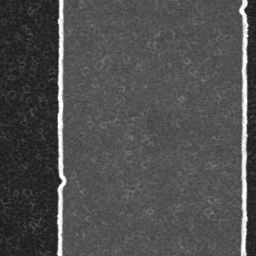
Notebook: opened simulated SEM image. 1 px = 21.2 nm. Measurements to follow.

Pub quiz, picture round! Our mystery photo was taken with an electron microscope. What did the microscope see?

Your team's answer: one or a few lines or trenches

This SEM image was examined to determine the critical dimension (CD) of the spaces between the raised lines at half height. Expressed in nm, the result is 3890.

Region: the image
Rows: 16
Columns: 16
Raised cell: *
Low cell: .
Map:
****...........*
****...........*
****...........*
****...........*
****...........*
****...........*
****...........*
****...........*
****...........*
****...........*
****...........*
****...........*
****...........*
****...........*
****...........*
****...........*